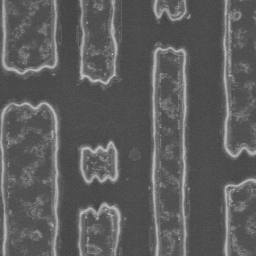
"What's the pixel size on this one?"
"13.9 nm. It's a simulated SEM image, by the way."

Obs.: one or a few lines or trenches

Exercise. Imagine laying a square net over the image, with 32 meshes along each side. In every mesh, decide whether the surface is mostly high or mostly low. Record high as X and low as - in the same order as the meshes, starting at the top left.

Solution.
XXXXXXX---XXXX-----XXXX-----XXXX
-XXXXXX---XXXX-----X-XX-----XXXX
-XXXXXX---XXXX--------------XXXX
-XXXXXX---XXXX--------------XXXX
-XXXXXX---XXXX--------------XXXX
-XXXXXX---XXXX--------------XXXX
XXXXXXX---XXXX------XXX-----XXXX
XXXXXXX---XXXX-----XXXX-----XXXX
-XXXX-----XXXX-----XXXX-----XXXX
-----------XXX-----XXXX-----XXXX
-------------------XXXX-----XXXX
-------------------XXXX-----XXXX
-------------------XXXX-----XXXX
-XXXXX-------------XXXX------XXX
XXXXXXX------------XXXX-----XXXX
XXXXXXX------------XXXX-----XXXX
XXXXXXX------------XXXX-----XXXX
XXXXXXX------------XXXX-----XXXX
XXXXXXX------X-----XXXX-----XXXX
XXXXXXX---XXXX-----XXXX---------
XXXXXXX---XXXX-----XXXX---------
XXXXXXX---XXXX-----XXXX---------
XXXXXXX------------XXXX---------
XXXXXXX------------XXXX-----XXXX
XXXXXXX------------XXXX-----XXXX
XXXXXXX------------XXXX-----XXXX
-XXXXXX---XXXXX----XXXX-----XXXX
-XXXXXX---XXXXX----XXXX-----XXXX
-XXXXXX---XXXXX-----XXX-----XXXX
-XXXXXX---XXXXX-----XXX-----XXXX
XXXXXXX---XXXXX-----XXX-----XXXX
-XXXXXX---XXXX------XXX-----XXXX